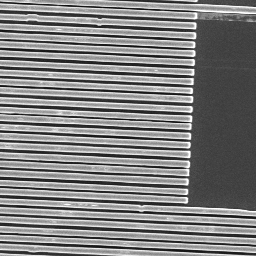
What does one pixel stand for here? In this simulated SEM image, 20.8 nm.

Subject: parallel lines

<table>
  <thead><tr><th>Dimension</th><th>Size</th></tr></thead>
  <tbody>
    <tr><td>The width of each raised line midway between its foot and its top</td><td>140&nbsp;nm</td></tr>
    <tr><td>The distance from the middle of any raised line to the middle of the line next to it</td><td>0.191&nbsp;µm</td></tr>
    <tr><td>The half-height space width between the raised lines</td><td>0.0596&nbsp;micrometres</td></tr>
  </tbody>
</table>